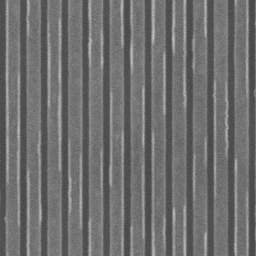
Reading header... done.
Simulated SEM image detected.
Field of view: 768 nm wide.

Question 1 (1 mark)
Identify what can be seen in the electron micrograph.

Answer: parallel lines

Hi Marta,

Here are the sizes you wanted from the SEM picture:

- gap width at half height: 0.0203 microns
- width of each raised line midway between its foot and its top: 40.2 nanometres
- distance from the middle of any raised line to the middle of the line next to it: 20.8 px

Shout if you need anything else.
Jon